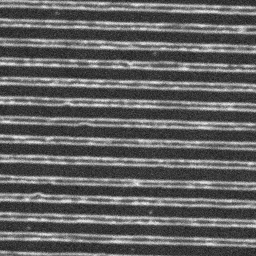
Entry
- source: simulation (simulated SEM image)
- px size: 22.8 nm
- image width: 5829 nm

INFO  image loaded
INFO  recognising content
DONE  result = parallel lines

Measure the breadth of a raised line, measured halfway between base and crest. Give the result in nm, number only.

134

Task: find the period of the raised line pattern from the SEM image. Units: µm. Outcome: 0.441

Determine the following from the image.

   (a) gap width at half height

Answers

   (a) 307 nm